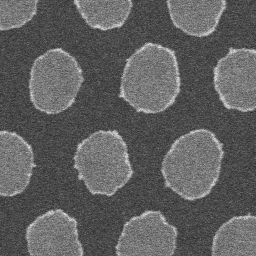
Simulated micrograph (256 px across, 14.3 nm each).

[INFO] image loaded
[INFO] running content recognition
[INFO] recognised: raised bodies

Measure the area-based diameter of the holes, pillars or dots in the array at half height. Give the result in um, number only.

0.87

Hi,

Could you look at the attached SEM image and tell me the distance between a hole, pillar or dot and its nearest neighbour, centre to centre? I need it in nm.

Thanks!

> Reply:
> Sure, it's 1320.